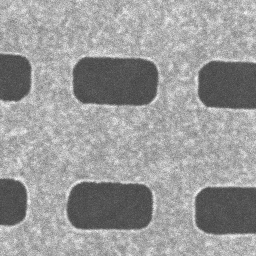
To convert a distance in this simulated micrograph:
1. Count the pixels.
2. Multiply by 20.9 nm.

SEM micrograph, holes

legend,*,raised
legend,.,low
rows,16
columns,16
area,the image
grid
****************
****************
****************
.***************
..***.....**....
..***.....**....
*****....****...
****************
****************
****************
****************
.****....*******
..**......**....
..**......**....
*************...
****************